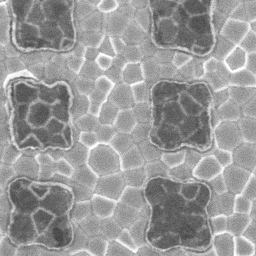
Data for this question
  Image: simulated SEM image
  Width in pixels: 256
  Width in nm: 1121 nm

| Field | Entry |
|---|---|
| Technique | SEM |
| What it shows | raised bodies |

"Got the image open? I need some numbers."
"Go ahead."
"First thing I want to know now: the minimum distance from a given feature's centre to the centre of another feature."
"432 nm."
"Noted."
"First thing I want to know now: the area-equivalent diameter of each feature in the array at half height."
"310 nanometers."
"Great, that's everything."